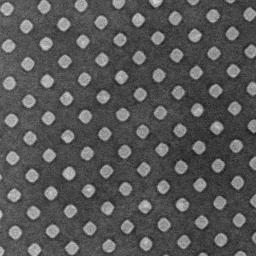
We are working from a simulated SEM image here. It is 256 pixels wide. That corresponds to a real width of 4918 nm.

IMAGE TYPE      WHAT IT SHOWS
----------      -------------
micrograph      a regular array of raised bodies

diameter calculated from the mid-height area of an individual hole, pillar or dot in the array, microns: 0.226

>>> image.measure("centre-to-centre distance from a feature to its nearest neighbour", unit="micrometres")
0.499